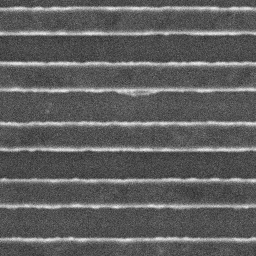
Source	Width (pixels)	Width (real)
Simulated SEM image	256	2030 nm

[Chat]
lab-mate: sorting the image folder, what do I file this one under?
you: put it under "lines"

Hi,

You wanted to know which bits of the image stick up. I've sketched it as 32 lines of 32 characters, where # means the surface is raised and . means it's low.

................................
################################
################################
################################
................................
................................
................................
................................
################################
################################
################################
................................
................................
................................
................................
################################
################################
################################
################################
................................
................................
................................
################################
################################
################################
################################
................................
................................
................................
................................
################################
################################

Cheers